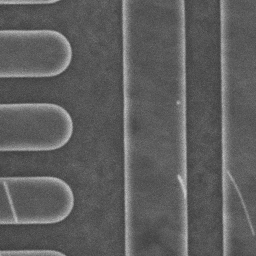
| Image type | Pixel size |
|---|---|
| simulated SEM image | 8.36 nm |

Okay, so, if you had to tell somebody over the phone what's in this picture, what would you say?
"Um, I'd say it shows groups of lines, slits or small figures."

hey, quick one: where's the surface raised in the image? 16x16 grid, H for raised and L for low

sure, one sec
LLLLLLLLHHHHLLHH
LLLLLLLLHHHHLLHH
HHHHLLLLHHHHLLHH
HHHHLLLLHHHHLLHH
HHHHLLLLHHHHLLHH
LLLLLLLLHHHHLLHH
LLLLLLLLHHHHLLHH
HHHHLLLLHHHHLLHH
HHHHLLLLHHHHLLHH
LLLLLLLLHHHHLLHH
LLLLLLLLHHHHLLHH
HHHHLLLLHHHHLLHH
HHHHHLLLHHHHLLHH
HHHHLLLLHHHHLLHH
LLLLLLLLHHHHLLHH
LLLLLLLLHHHHLLHH